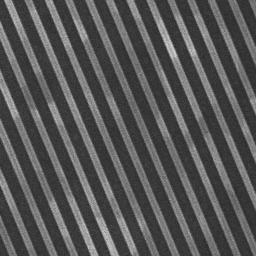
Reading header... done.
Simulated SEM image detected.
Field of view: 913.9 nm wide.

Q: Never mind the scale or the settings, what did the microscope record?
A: parallel lines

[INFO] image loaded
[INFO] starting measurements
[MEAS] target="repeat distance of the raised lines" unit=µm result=0.0671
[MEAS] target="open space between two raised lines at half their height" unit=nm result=44.5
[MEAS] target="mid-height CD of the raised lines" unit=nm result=24.3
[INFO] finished